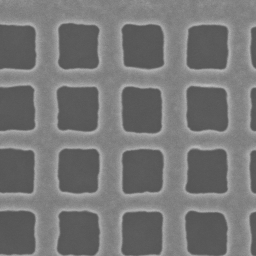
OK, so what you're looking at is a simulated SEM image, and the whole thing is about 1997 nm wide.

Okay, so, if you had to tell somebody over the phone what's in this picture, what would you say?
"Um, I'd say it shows a regular array of holes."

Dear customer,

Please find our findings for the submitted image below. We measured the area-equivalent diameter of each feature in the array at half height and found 367 nanometres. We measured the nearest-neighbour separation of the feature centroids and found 484 nm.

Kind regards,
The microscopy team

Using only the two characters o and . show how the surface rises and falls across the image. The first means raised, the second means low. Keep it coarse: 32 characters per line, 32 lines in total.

oooooooooooooooooooooooooooooooo
oooooooooooooooooooooooooooooooo
oooooooooooooooooooooooooooooooo
....ooo.....ooo.....oooo....oooo
.....oo.....ooo.....ooo......oo.
....ooo.....ooo......oo......oo.
.....oo.....ooo......oo......oo.
.....oo.....ooo......oo.....ooo.
....oooo....ooooo...oooo....oooo
oooooooooooooooooooooooooooooooo
oooooooooooooooooooooooooooooooo
....ooo.....ooo.....ooo.....ooo.
....ooo.....ooo.....ooo.....ooo.
....ooo.....ooo.....ooo.....ooo.
....ooo.....ooo.....ooo.....ooo.
....ooo.....ooo.....ooo.....ooo.
oooooooooo.ooooo....oooooooooooo
oooooooooooooooooooooooooooooooo
..oooooooooooooooooooooooooooooo
....ooo.....ooo.....ooo.....ooo.
....ooo.....ooo......oo.....ooo.
....ooo.....ooo.....ooo.....ooo.
....ooo.....ooo.....ooo.....ooo.
....ooo.....ooo.....ooo.....ooo.
oooooooooooooooooooooooooooooooo
oooooooooooooooooooooooooooooooo
....oooo...oooooo...oooo.o.ooooo
....ooo.....ooo.....ooo.....ooo.
....ooo.....ooo.....ooo.....ooo.
....ooo.....ooo.....ooo.....ooo.
....ooo.....ooo.....ooo.....ooo.
....ooo.....ooo.....oooo....ooo.